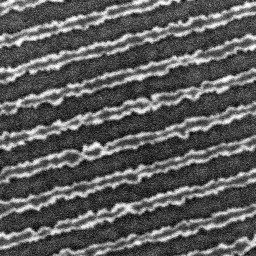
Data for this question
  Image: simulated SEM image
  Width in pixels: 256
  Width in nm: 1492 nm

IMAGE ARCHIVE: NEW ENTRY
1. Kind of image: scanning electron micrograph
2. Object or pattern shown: parallel lines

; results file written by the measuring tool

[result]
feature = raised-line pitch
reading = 188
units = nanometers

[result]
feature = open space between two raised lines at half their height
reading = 131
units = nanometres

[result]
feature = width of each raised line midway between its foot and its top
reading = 0.0564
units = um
